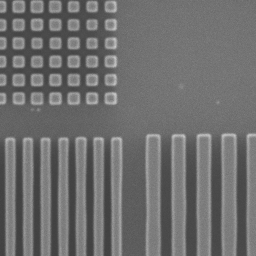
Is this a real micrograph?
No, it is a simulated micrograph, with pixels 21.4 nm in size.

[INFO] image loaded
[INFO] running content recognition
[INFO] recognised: groups of lines, slits or small figures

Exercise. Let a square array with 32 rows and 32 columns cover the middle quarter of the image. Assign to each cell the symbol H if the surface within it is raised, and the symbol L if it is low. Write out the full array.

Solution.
LHHHLLHHLLLHHLLLLLLLLLLLLLLLLLLL
LLLLLLLLLLLLLLLLLLLLLLLLLLLLLLLL
LLLLLLLLLLLLLLLLLLLLLLLLLLLLLLLL
LHHHLLHHLLHHHLLLLLLLLLLLLLLLLLLL
LHHHLLHHLLHHHLLLLLLLLLLLLLLLLLLL
LLLLLLLLLLLLLLLLLLLLLLLLLLLLLLLL
LLLLLLLLLLLLLLLLLLLLLLLLLLLLLLLL
LHHHLLHHLLLHHLLLLLLLLLLLLLLLLLLL
LHHHLLHHLLHHHLLLLLLLLLLLLLLLLLLL
LHHHLLHHLLLHHLLLLLLLLLLLLLLLLLLL
LLLLLLLLLLLLLLLLLLLLLLLLLLLLLLLL
LLLLLLLLLLLLLLLLLLLLLLLLLLLLLLLL
LLLLLLLLLLLLLLLLLLLLLLLLLLLLLLLL
LLLLLLLLLLLLLLLLLLLLLLLLLLLLLLLL
LLLLLLLLLLLLLLLLLLLLLLLLLLLLLLLL
LLLLLLLLLLLLLLLLLLLLLLLLLLLLLLLL
LLLLLLLLLLLLLLLLLLLLLLLLLLLLLLLL
LLLLLLLLLLLLLLLLLLLLLLLLLLLLLLLL
LLLHHLLLLLLLLLLLLLLLLHHHLLLHHHLL
HLLHHLLLHHLLHHLLLLLLLHHHLLLHHHLL
HLLHHLLLHHLLHHLLLLLLLHHHLLLHHHLL
HLLHHLLLHHLLHHLLLLLLLHHHLLLHHHLL
HLLHHLLLHHLLHHLLLLLLLHHHLLLHHHLL
HLLHHLLLHHLLHHLLLLLLLHHHLLLHHHLL
HLLHHLLLHHLLHHLLLLLLLHHHLLLHHHLL
HLLHHLLLHHLLHHLLLLLLLHHHLLLHHHLL
HLLHHLLLHHLLHHLLLLLLLHHHLLLHHHLL
HLLHHLLLHHLLHHLLLLLLLHHHLLLHHHLL
HLLHHLLLHHLLHHLLLLLLLHHHLLLHHHLL
HLLHHLLLHHLLHHLLLLLLLHHHLLLHHHLL
HLLHHLLLHHLLHHLLLLLLLHHHLLLHHHLL
HLLHHLLLHHLLHHLLLLLLLHHHLLLHHHLL